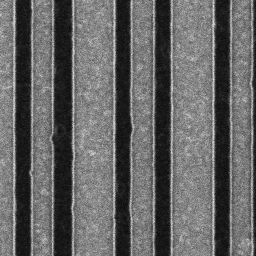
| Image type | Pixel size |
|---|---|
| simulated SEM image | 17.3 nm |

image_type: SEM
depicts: parallel lines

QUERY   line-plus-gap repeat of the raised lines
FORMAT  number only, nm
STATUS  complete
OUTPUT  861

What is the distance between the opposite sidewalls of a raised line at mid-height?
18.6 pixels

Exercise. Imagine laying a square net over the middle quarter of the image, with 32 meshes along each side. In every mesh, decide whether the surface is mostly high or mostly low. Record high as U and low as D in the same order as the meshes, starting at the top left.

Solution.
UUDDDDDDDDDDDUUUUDDDDDUUUUUDDDDD
UUDDDDDDDDDDDUUUUDDDDDUUUUUDDDDD
UUDDDDDDDDDDDUUUUDDDDDUUUUUDDDDD
UUDDDDDDDDDDDUUUUDDDDDUUUUUDDDDD
UUDDDDDDDDDDDUUUUDDDDDUUUUUDDDDD
UUDDDDDDDDDDDUUUUDDDDDUUUUUDDDDD
UUDDDDDDDDDDDUUUUDDDDDUUUUUDDDDD
UUDDDDDDDDDDDUUUUDDDDDUUUUUDDDDD
UUDDDDDDDDDDUUUUUDDDDDUUUUUDDDDD
UUDDDDDDDDDDDUUUUDDDDDUUUUUDDDDD
UUDDDDDDDDDDDUUUUDDDDDUUUUUDDDDD
UUDDDDDDDDDDDUUUUDDDDDUUUUUDDDDD
UUDDDDDDDDDDUUUUUDDDDDUUUUUDDDDD
UUDDDDDDDDDDUUUUUDDDDDUUUUUDDDDD
UUDDDDDDDDDDDUUUUDDDDDUUUUUDDDDD
UUDDDDDDDDDDDUUUUDDDDDUUUUUDDDDD
UUDDDDDDDDDDDUUUUDDDDDUUUUUDDDDD
UUDDDDDDDDDDUUUUUDDDDDUUUUUDDDDD
UUDDDDDDDDDDUUUUUDDDDDUUUUUDDDDD
UUDDDDDDDDDDUUUUUDDDDDUUUUUDDDDD
UUDDDDDDDDDDUUUUUDDDDDUUUUUDDDDD
UUDDDDDDDDDDUUUUUDDDDDUUUUUDDDDD
UUDDDDDDDDDDUUUUUDDDDDUUUUUDDDDD
UUDDDDDDDDDDUUUUUDDDDDUUUUUDDDDD
UUDDDDDDDDDDUUUUUDDDDDUUUUUDDDDD
UUDDDDDDDDDDUUUUUDDDDDUUUUUDDDDD
UUDDDDDDDDDDUUUUUDDDDDUUUUUDDDDD
UUDDDDDDDDDDUUUUUDDDDDUUUUUDDDDD
UUDDDDDDDDDDUUUUUDDDDDUUUUUDDDDD
UUDDDDDDDDDDUUUUUDDDDDUUUUUDDDDD
UUDDDDDDDDDDDUUUUDDDDDUUUUUDDDDD
UUDDDDDDDDDDDUUUUDDDDDUUUUUDDDDD